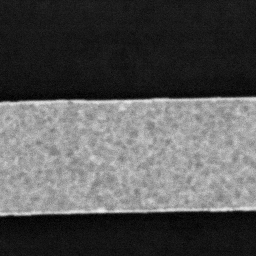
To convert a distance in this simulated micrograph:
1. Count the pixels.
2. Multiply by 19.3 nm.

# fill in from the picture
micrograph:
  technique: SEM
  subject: one or a few lines or trenches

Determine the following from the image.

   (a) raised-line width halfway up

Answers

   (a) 2.09 microns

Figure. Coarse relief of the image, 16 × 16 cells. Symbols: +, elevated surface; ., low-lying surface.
................
................
................
................
................
................
.+++++++++++++++
++++++++++++++++
++++++++++++++++
++++++++++++++++
++++++++++++++++
++++++++++++++++
++++++++++++++++
................
................
................